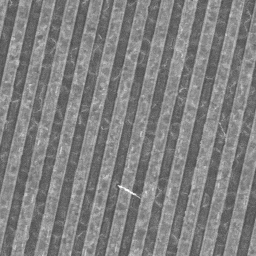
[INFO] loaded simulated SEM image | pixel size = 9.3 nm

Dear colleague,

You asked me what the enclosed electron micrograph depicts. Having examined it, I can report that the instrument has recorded parallel lines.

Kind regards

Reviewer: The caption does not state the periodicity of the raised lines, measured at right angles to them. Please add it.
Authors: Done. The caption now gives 215 nm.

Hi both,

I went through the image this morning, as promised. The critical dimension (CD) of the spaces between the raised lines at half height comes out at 106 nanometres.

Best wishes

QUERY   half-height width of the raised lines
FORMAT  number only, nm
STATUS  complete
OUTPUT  106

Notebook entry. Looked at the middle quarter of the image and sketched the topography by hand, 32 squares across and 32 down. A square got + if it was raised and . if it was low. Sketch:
...+++...+++...+++...+++...+++..
...+++...+++...+++...+++...+++..
...+++...+++..++++..+++...+++...
...+++..+++...+++...+++...+++...
..+++...+++...+++...+++...+++...
..+++...+++...+++...+++...++....
..+++...+++...+++...++....++...+
..++....++....++...+++...+++...+
.+++...+++...+++...+++...+++...+
.+++...+++...+++...+++...+++...+
.+++...+++...+++...+++...++....+
.+++...+++...+++...++....++...++
.++....++....++...+++...+++...++
+++...+++...+++...+++...+++...++
+++...+++...+++...+++...++....++
+++...+++...+++...++....++...+++
++....++...+++...+++...+++...+++
++...+++...+++...+++...+++...+++
++...+++...+++...+++...+++...+++
++...+++...+++...+++...++....++.
++...+++...+++..+++...+++...+++.
+....++....++...+++...+++...+++.
+...+++...+++...+++...+++...+++.
+...+++...+++...+++...+++...++..
+...+++...+++...++...+++...+++..
....++....++...+++...+++...+++..
...+++...+++...+++...+++...+++..
...+++...+++...+++...+++...+++..
...+++...+++...+++...+++...++...
...+++...+++...++...+++...+++...
..+++....++...+++...+++...+++...
..+++...+++...+++...+++...+++...